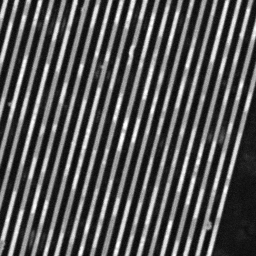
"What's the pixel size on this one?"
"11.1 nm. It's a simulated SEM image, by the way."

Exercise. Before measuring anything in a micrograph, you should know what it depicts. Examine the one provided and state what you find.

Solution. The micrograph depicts parallel lines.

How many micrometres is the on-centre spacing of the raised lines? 0.125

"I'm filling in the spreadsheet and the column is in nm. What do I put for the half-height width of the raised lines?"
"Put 32.2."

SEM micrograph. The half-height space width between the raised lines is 0.0978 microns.